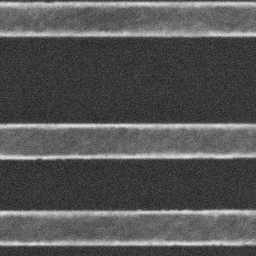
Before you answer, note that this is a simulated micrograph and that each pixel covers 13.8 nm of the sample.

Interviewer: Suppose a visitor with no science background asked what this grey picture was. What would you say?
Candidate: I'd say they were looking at lines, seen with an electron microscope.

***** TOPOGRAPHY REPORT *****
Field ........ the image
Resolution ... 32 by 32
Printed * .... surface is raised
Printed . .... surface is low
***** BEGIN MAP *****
**......****..*****......*******
********************************
********************************
********************************
................................
................................
................................
................................
................................
................................
................................
................................
................................
................................
................................
................................
********************************
********************************
********************************
*******************...**..***...
................................
................................
................................
................................
................................
................................
..................*******..***..
********************************
********************************
********************************
..*.*...........................
................................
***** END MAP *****